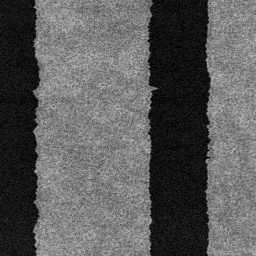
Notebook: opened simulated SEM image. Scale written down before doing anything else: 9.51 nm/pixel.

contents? one or a few lines or trenches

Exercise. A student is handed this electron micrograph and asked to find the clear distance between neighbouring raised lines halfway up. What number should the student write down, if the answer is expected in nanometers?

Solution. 564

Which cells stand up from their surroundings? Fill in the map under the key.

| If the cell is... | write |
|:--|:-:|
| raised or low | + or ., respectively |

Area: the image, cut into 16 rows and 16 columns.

..+++++++....+++
..+++++++....+++
..+++++++....+++
..+++++++....+++
..+++++++....+++
..+++++++....+++
..+++++++....+++
..+++++++....+++
..+++++++....+++
..+++++++....+++
..+++++++....+++
..+++++++....+++
..+++++++....+++
..+++++++....+++
..+++++++....+++
..+++++++....+++